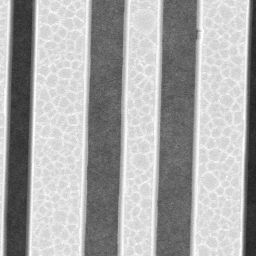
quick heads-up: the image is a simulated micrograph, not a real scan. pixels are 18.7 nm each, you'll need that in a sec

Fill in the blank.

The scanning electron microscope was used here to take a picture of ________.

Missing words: one or a few lines or trenches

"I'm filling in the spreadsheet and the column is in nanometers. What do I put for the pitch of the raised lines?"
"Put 1520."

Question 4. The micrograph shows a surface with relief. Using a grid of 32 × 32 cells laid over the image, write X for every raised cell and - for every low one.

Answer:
X---XXXXXXX-----XXXX-----XXXXXX-
X---XXXXXXX-----XXXX-----XXXXXX-
X---XXXXXXX-----XXXX-----XXXXXX-
X---XXXXXXX-----XXXX-----XXXXXX-
X---XXXXXXX-----XXXX-----XXXXXX-
X---XXXXXXX-----XXXX-----XXXXXX-
X---XXXXXXX-----XXXX-----XXXXXX-
X---XXXXXXX-----XXXX-----XXXXXX-
X---XXXXXXX-----XXXX-----XXXXXX-
X---XXXXXXX-----XXXX-----XXXXXX-
X---XXXXXXX-----XXXX-----XXXXXX-
X---XXXXXXX-----XXXX-----XXXXXX-
X---XXXXXXX-----XXXX-----XXXXXX-
X---XXXXXXX-----XXXX-----XXXXXX-
X---XXXXXXX-----XXXX-----XXXXXX-
X---XXXXXXX----XXXXX-----XXXXXX-
X---XXXXXXX----XXXXX----XXXXXXX-
X---XXXXXXX----XXXXX----XXXXXXX-
X---XXXXXXX----XXXXX----XXXXXXX-
X---XXXXXXX----XXXXX----XXXXXXX-
X---XXXXXXX----XXXXX----XXXXXXX-
X---XXXXXXX----XXXXX----XXXXXXX-
X---XXXXXXX----XXXXX----XXXXXXX-
X---XXXXXX-----XXXX-----XXXXXXX-
X---XXXXXX-----XXXX-----XXXXXXX-
X---XXXXXX-----XXXX-----XXXXXXX-
X---XXXXXX-----XXXX-----XXXXXXX-
X---XXXXXX-----XXXX-----XXXXXX--
----XXXXXX-----XXXX-----XXXXXX--
----XXXXXX-----XXXX-----XXXXXX--
----XXXXXX-----XXXX-----XXXXXX--
---XXXXXXX-----XXXX-----XXXXXX--